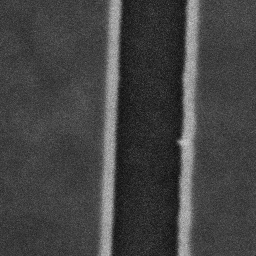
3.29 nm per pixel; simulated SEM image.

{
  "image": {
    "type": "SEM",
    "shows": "one or a few lines or trenches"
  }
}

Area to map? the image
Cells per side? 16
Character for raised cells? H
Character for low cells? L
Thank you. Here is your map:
HHHHHHHLLLLLHHHH
HHHHHHHLLLLLHHHH
HHHHHHHLLLLLHHHH
HHHHHHHLLLLLHHHH
HHHHHHHLLLLLHHHH
HHHHHHHLLLLLHHHH
HHHHHHHLLLLLHHHH
HHHHHHHLLLLLHHHH
HHHHHHHLLLLLHHHH
HHHHHHHLLLLLHHHH
HHHHHHHLLLLLHHHH
HHHHHHHLLLLLHHHH
HHHHHHHLLLLHHHHH
HHHHHHHLLLLLHHHH
HHHHHHHLLLLHHHHH
HHHHHHHLLLLHHHHH